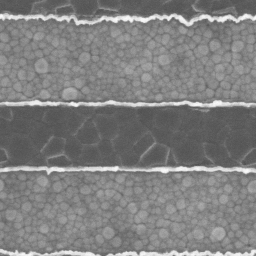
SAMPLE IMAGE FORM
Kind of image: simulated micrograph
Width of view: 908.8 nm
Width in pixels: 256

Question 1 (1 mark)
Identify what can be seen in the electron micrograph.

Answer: one or a few lines or trenches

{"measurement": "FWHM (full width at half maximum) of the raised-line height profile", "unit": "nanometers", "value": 243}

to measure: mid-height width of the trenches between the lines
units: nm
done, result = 292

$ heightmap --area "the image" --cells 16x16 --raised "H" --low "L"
HHHHHHHHHHHHHHHH
LLLLLLLLLLLLLLLL
LLLLLLLLLLLLLLLL
LLLLLLLLLLLLLLLL
LLLLLLLLLLLLLLLL
LLLLLLLLLLLLLLLL
HHHHHHHHHHHHHHHH
HHHHHHHHHHHHHHHH
HHHHHHHHHHHHHHHH
HHHHHHHHHHHHHHHH
HHHHHHHHHHHHHHHH
LLLLLLLLLLLLLLLL
LLLLLLLLLLLLLLLL
LLLLLLLLLLLLLLLL
LLLLLLLLLLLLLLLL
LLLLLLLLLLLLLLLL